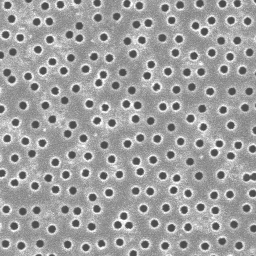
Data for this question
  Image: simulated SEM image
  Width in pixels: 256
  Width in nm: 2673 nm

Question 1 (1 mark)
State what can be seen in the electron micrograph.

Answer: a regular array of holes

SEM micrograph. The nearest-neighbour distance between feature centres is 15.3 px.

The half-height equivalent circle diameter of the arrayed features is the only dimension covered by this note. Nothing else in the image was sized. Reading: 84.9 nm